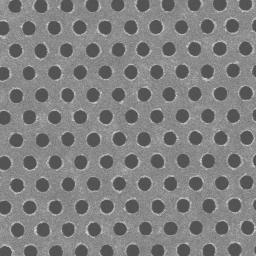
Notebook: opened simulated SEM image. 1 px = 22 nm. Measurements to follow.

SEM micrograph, a regular array of holes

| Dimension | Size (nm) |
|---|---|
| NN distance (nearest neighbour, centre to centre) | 553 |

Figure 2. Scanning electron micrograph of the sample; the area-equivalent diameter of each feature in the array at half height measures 309 nanometers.